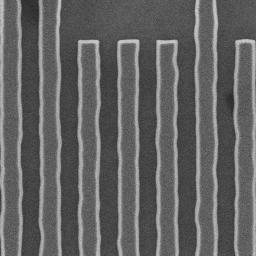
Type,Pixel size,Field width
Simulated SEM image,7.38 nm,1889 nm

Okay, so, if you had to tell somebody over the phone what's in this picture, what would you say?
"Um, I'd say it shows groups of lines, slits or small figures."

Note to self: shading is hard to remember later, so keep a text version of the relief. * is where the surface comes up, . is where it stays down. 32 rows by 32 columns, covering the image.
**...**..................**.....
**...**..................**.....
**...**..................**.....
***..**..................**.....
***..**..................**.....
**...**...**...**...**...**...**
***..**...**...**...**...**...**
***..**...**...**...**...**...**
**...**...**...**...**...**...**
**...**...**...**...**...**...**
***..**...**...**...**...**..***
***..**...**...**...**...**..***
**...**...**...**...**...**...**
***..**...**...**...**...**..***
***..**...**...**...**...**..***
***..**...**...**...**...**..***
***..**...**...**...**...**...**
***..**...**...**...**...**...**
**...**...**...**...**...**...**
**...**...**...**...**...**...**
**...**...**...**...**...**...**
***..**...**...**...**...**...**
***..**...**...**...**...**...**
***..**...**...**...**...**...**
***..**...**...**...**...**...**
***..**...**...**...**...**...**
***..**...**...**...**...**...**
***..**...**...**...**...**...**
***..**...**...**...**...**...**
***..**...**...**...**...**...**
***..**...**...**...**...**...**
***..**...**...**...**...**...**